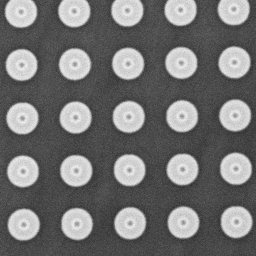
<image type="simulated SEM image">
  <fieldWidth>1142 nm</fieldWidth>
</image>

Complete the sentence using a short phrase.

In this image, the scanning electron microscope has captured an array of small figures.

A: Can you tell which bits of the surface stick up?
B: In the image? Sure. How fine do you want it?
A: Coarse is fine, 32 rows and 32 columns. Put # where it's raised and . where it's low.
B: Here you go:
.###....###...####...###...####.
.####..####...####...###...####.
.###....###...###....###....###.
................................
................................
................................
..##....###....##....###....###.
.####..####...####...####..####.
.####..####...####...####..####.
.###....###....##.....##....##..
................................
................................
................................
.###....###....###...###....###.
.####...###...####...####..####.
.####...###...####...###....###.
..##.....#......#...............
................................
................................
.........#.....##.....##....###.
.####...###...####...####...###.
.####...###...####...####...###.
.###....###....###...###....###.
................................
................................
................................
..##....###....###....##....###.
.####...###...####...####...###.
.####...###...####...####...###.
..##....###....##.....##.....#..
................................
................................